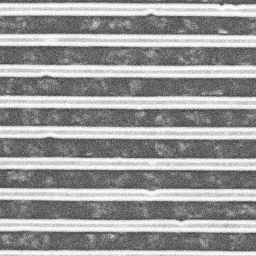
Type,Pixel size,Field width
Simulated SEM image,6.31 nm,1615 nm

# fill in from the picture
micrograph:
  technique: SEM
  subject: parallel lines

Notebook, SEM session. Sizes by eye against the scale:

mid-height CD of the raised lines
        8.75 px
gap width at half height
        139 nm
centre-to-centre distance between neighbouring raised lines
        0.195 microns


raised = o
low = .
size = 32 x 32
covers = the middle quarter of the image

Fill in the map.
................................
oooooooooooooooooooooooooooooooo
oooooooooooooooooooooooooooooooo
................................
................................
................................
................................
................................
................................
oooooooooooooooooooooooooooooooo
oooooooooooooooooooooooooooooooo
................................
................................
................................
................................
................................
oooooooooooooooooooooooooooooooo
oooooooooooooooooooooooooooooooo
................................
................................
................................
................................
................................
................................
oooooooooooooooooooooooooooooooo
oooooooooooooooooooooooooooooooo
................................
................................
................................
................................
................................
................................